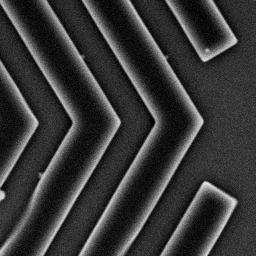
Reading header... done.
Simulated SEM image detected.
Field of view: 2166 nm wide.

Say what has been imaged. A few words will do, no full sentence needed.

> groups of lines, slits or small figures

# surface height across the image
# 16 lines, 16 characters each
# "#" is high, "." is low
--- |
###..###...###..
.###..###..###..
.###...###..###.
..###..###......
...###..###.....
#..###..###.....
##..###..###....
##..###...###...
##..###..###....
#...##...###....
#..###..###.....
..###...##......
..###..###..##..
..##..###..###..
.###..###..###..
###..###..###...